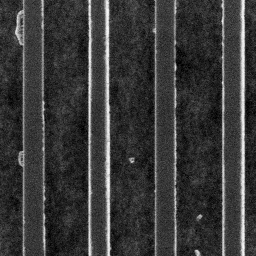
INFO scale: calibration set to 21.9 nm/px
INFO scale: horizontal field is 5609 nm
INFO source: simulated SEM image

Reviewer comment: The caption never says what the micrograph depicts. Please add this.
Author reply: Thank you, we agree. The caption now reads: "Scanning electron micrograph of lines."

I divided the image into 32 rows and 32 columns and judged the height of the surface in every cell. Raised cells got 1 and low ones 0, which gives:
00011000000110000001110000001100
00011000000110000001110000001100
00011000000110000001110000001100
00011000000110000001110000001100
00011000000110000001110000001100
00011000000110000001110000001100
00011000000110000001110000001100
00011000000110000001110000001100
00011000000111000001110000001100
00011000000110000001110000001100
00011000000111000001110000001100
00011000000111000001110000001100
00011000000111000001110000001100
00011000000111000001110000001100
00011000000111000001110000001100
00011000000111000001110000001100
00011000000111000001110000001100
00011000000111000001110000001100
00011000000111000001110000001100
00011000000111000001110000001100
00011000000111000001110000001100
00011000000111000001110000001100
00011000000111000001110000001100
00011100000111000001110000001100
00011100000111000001110000001100
00011000000111000001110000001100
00011100000111000001110000001100
00011100000111000001110000001100
00011100000111000001110000001100
00011100000111000001110000001100
00011100000111000001110000001100
00011100000111000001110000001100